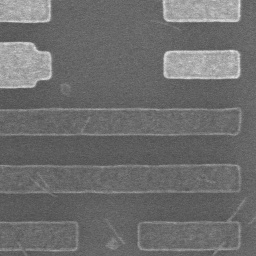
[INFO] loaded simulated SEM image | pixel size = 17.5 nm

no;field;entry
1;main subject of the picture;wiring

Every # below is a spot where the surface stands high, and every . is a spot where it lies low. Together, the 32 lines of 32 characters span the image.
######..............##########..
######..............##########..
######...............#########..
................................
................................
####............................
#####................########...
######...............#########..
######...............#########..
######...............#########..
####............................
................................
................................
................................
##############################..
##############################..
##############################..
................................
................................
................................
................................
##############################..
##############################..
##############################..
................................
................................
................................
................................
##########.......#############..
##########.......#############..
##########.......#############..
................................